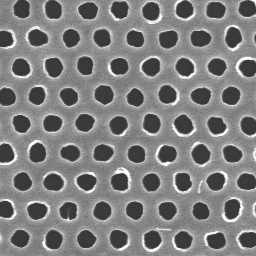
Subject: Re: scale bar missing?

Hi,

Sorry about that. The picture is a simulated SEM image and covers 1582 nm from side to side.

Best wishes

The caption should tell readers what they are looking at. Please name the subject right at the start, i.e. a regular array of holes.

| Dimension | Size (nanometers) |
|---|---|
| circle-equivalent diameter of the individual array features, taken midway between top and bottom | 110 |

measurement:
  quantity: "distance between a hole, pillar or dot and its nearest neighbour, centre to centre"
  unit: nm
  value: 196